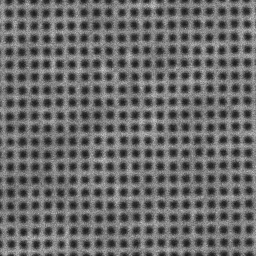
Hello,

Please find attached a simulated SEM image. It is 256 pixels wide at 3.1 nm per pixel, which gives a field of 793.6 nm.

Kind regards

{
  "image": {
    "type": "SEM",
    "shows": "a regular array of holes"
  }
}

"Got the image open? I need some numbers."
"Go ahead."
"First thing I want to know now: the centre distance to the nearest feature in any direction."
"37.6 nanometers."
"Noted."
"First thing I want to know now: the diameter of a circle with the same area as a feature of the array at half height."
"8.9 px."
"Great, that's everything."